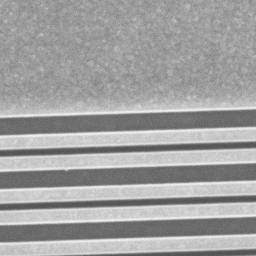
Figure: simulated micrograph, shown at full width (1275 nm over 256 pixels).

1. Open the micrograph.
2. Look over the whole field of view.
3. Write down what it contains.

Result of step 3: parallel lines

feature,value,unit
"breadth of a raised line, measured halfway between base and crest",65.9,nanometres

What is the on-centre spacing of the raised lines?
132 nm